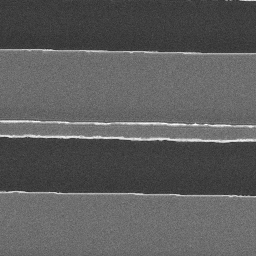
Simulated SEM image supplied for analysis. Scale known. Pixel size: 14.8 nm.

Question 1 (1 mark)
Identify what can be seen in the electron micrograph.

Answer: lines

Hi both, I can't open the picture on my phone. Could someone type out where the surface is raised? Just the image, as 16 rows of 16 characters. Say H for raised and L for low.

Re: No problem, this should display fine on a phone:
LLLLLLLLLLLLLLLL
LLLLLLLLLLLLLLLL
LLLLLLLLLLLLLLLL
HHHHHHHHHHHHHHHH
HHHHHHHHHHHHHHHH
HHHHHHHHHHHHHHHH
HHHHHHHHHHHHHHHH
HHHHHHHHHHHHHHHH
HHHHHHHHHHHHHHHH
LLLLLLLLLLLLLLLL
LLLLLLLLLLLLLLLL
LLLLLLLLLLLLLLLL
HHHHHHHHHHHHHHHH
HHHHHHHHHHHHHHHH
HHHHHHHHHHHHHHHH
HHHHHHHHHHHHHHHH